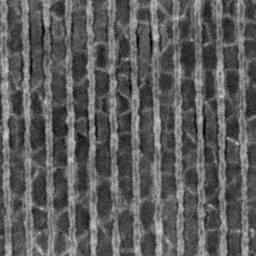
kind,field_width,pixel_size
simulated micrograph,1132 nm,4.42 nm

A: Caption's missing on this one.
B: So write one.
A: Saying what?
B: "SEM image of parallel lines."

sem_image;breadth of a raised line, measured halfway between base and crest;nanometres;24.3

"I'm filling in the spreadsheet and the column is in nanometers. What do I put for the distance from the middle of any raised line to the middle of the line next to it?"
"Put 95.3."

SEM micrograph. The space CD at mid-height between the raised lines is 69.6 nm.